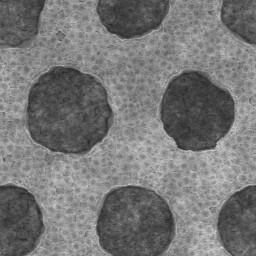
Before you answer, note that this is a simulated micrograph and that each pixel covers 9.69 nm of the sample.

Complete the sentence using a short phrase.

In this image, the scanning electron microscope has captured holes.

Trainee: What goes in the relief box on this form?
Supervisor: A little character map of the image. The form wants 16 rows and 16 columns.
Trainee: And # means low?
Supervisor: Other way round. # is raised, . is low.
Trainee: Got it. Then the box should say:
...###.....###..
...###....####..
..#############.
################
###..#######.###
##....####....##
##.....###.....#
##.....###.....#
##.....####...##
####.###########
################
################
..####....####..
...###.....###..
...###.....###..
..####....####..